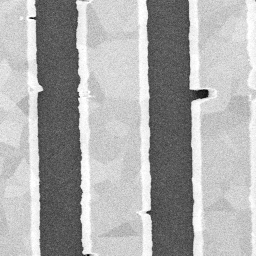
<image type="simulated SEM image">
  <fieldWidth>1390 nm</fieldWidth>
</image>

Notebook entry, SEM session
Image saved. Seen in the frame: one or a few lines or trenches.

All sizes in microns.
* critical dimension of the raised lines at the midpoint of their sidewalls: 0.334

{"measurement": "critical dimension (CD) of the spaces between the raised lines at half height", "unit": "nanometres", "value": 271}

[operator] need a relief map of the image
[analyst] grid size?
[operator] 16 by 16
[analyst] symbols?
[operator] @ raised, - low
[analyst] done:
@@---@@@@---@@@@
@@---@@@@---@@@@
@@---@@@@---@@@@
@@---@@@@---@@@@
@@---@@@@---@@@@
@@---@@@@----@@@
@@---@@@@---@@@@
@@---@@@@---@@@@
@@---@@@@---@@@@
@@---@@@@---@@@@
@@---@@@@---@@@@
@@---@@@@---@@@@
@@---@@@@---@@@@
@@---@@@@---@@@@
@@---@@@@---@@@@
@@---@@@@---@@@@